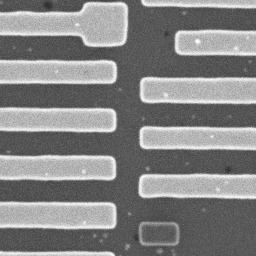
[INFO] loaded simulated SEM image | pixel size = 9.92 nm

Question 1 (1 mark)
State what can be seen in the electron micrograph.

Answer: wiring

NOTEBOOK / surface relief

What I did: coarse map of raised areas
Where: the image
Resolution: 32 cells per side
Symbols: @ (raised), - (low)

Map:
-----------@@@@@--@@@@@@@@@@@@@@
----------@@@@@@----------------
@@@@@@@@@@@@@@@@----------------
@@@@@@@@@@@@@@@@----------------
----------@@@@@@------@@@@@@@@@@
-----------@@@@-------@@@@@@@@@@
----------------------@@@@@@@@@@
--------------------------------
@@@@@@@@@@@@@@------------------
@@@@@@@@@@@@@@------------------
------------------@@@@@@@@@@@@@@
------------------@@@@@@@@@@@@@@
------------------@@@@@@@@@@@@@@
--------------------------------
@@@@@@@@@@@@@@------------------
@@@@@@@@@@@@@@------------------
------------------@@@@@@@@@@@@@@
------------------@@@@@@@@@@@@@@
------------------@@@@@@@@@@@@@@
@-----@-------------------------
@@@@@@@@@@@@@@------------------
@@@@@@@@@@@@@@------------------
-----------------@@@@@@@@@@@@@@@
-----------------@@@@@@@@@@@@@@@
------------------@@@@@@@@@@@@@@
@@@@@@@@@@@@@@------------------
@@@@@@@@@@@@@@------------------
@@@@@@@@@@@@@@------------------
--------@@-------@@@@@----------
-----------------@@@@@----------
------------------@@@@----------
--------------------------------